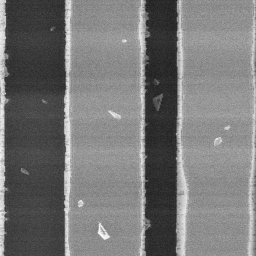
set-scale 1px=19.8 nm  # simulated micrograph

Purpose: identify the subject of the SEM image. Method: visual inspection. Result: lines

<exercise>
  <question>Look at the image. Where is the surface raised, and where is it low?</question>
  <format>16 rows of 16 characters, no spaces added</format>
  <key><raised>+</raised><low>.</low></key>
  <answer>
....+++++..+++++
....+++++..+++++
....+++++..+++++
....+++++..+++++
....+++++..+++++
....+++++..+++++
....+++++..+++++
....+++++..+++++
....+++++..+++++
....+++++..+++++
....+++++..+++++
....+++++..+++++
....+++++..+++++
....+++++..+++++
....+++++..+++++
....+++++..+++++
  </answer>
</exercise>